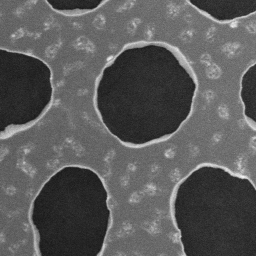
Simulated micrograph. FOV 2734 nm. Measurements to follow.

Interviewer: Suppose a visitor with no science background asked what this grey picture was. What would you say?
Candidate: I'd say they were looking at holes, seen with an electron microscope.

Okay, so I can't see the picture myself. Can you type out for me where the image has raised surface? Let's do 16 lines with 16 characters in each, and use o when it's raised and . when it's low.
ooo...oooooo....
oooooooooooooooo
oooooooooooooooo
..ooooo....ooooo
...ooo......ooo.
...ooo......ooo.
...ooo......ooo.
..oooo......oooo
ooooooo...oooooo
oooooooooooooooo
oooo.oooooooo.oo
ooo...ooooo.....
oo.....oooo.....
oo.....oooo.....
oo.....oooo.....
oo....ooooo.....